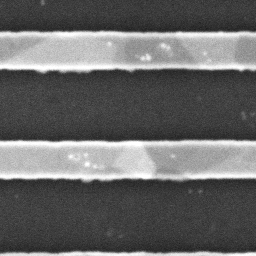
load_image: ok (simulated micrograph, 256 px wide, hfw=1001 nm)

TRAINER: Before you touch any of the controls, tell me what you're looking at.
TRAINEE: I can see lines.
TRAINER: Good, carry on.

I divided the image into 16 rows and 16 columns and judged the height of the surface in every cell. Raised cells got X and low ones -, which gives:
----------------
----------------
XXXXXXXXXXXXXXXX
XXXXXXXXXXXXXXXX
----------------
----------------
----------------
----------------
----------------
XXXXXXXXXXXXXXXX
XXXXXXXXXXXXXXXX
----------------
----------------
----------------
----------------
----------------